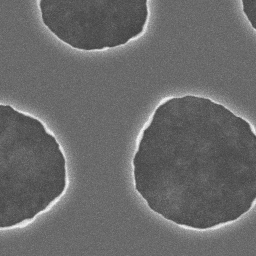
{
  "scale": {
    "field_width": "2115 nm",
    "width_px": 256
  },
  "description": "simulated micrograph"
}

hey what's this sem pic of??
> holes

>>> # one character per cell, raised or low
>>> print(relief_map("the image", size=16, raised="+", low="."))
++.......++++++.
+++......+++++++
++++....++++++++
++++++++++++++++
++++++++++++++++
++++++++++++++++
++++++++++....++
..+++++++......+
...++++++.......
....+++++.......
....++++........
....++++........
...++++++.......
..++++++++.....+
++++++++++++++++
++++++++++++++++